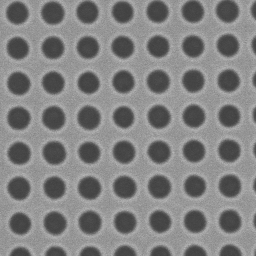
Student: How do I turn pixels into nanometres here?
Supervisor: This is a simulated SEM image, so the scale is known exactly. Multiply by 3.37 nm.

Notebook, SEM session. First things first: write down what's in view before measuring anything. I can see a regular array of holes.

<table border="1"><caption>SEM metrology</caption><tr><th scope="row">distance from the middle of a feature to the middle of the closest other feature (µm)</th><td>0.117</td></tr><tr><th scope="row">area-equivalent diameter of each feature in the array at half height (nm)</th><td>72.5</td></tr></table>